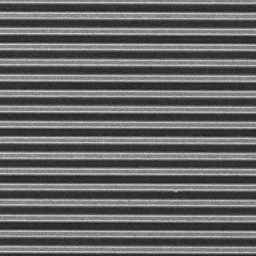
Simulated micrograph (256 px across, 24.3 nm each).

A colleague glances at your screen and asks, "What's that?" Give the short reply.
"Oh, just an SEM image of parallel lines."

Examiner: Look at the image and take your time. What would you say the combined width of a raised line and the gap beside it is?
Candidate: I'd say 379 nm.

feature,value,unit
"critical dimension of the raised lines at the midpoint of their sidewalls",176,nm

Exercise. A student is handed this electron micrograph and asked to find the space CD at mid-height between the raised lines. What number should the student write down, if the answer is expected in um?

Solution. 0.198